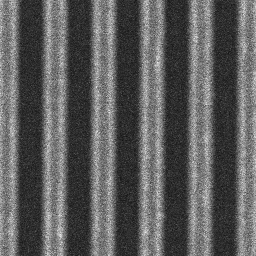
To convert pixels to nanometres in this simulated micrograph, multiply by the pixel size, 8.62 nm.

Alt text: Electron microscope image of parallel lines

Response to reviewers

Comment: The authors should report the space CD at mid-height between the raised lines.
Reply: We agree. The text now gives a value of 0.241 microns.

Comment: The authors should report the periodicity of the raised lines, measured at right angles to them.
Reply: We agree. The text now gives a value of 419 nanometers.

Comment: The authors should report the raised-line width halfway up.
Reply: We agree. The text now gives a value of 176 nm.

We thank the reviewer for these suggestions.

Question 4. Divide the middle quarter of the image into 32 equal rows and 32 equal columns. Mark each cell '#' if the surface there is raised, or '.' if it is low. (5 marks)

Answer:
.......#####........#####.......
.......#####........#####.......
.......#####........#####.......
.......#####........#####.......
.......#####........#####.......
.......#####.......######.......
........####.......######.......
........####.......######.......
.......#####.......#####........
.......#####.......#####........
........####.......#####........
........####.......#####........
........####.......#####........
........####.......#####........
.......#####.......#####........
.......#####.......#####........
.......#####.......#####........
.......#####.......#####........
.......#####.......#####........
.......#####.......#####........
.......#####.......#####........
.......#####.......#####........
.......#####.......#####........
.......#####.......#####........
.......#####.......#####........
.......#####.......#####........
.......#####.......#####........
.......#####.......#####........
.......#####.......#####........
.......#####.......#####........
.......#####.......#####........
.......#####.......#####........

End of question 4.